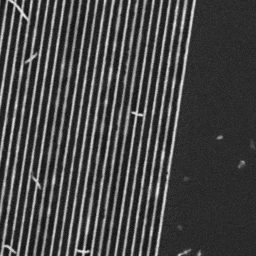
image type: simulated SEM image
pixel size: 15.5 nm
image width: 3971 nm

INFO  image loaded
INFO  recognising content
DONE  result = parallel lines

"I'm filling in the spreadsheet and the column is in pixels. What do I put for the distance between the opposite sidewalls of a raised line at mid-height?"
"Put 1.97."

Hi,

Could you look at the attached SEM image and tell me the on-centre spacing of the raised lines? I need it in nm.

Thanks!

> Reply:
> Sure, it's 125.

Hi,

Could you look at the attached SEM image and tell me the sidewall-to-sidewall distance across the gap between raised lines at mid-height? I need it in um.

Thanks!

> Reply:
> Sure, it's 0.092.